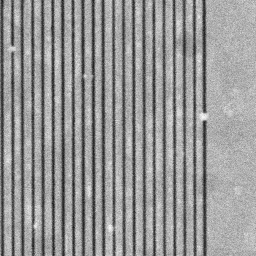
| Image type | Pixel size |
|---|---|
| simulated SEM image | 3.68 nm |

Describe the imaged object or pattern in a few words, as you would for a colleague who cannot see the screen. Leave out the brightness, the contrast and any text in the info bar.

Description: parallel lines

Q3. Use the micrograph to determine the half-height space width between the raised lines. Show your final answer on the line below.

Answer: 11.1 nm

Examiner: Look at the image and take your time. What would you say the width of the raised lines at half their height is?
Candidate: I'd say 0.0249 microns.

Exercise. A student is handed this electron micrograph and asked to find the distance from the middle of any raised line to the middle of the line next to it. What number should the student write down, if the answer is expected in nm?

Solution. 37.2